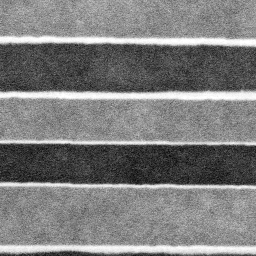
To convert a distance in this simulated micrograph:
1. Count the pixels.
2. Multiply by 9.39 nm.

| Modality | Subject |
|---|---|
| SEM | lines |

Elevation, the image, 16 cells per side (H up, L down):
HHHHHHHHHHHHHHHH
HHHHHHHHHHHHHHHH
LLLLLLLHHHHHHHHH
LLLLLLLLLLLLLLLL
LLLLLLLLLLLLLLLL
LLLLLLLLLLLLLLLL
HHHHHHHHHHHHHHHH
HHHHHHHHHHHHHHHH
HHHHHHHHHHHHHHHH
LLLLLLLLLLLLLLLL
LLLLLLLLLLLLLLLL
LLLLLLLLLLLLLLLL
HHHHHHHHHHHHHHHH
HHHHHHHHHHHHHHHH
HHHHHHHHHHHHHHHH
LLLLLLLLHHHHHHHH